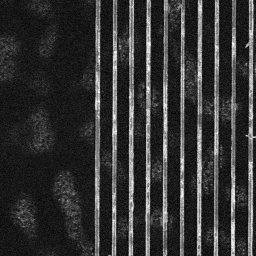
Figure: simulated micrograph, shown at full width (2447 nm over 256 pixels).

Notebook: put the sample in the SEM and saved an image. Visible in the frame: parallel lines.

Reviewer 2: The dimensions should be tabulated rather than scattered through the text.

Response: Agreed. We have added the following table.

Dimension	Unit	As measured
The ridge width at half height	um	0.0311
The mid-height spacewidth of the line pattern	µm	0.13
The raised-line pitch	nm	162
